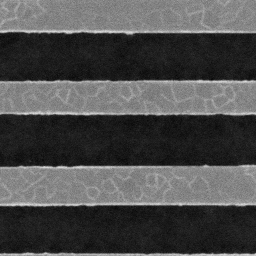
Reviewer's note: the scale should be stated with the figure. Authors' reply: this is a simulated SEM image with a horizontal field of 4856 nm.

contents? lines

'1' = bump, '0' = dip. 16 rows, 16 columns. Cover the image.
1111111111111111
1111111111111111
0000000000000000
0000000000000000
0000000000000000
1111111111111111
1111111111111111
0000000000000000
0000000000000000
0000000000000000
1111111111111111
1111111111111111
1111111111111111
0000000000000000
0000000000000000
0000000000000000